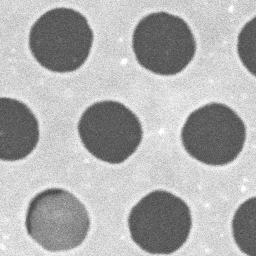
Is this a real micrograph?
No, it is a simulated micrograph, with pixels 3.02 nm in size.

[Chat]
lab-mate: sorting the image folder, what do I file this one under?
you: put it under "holes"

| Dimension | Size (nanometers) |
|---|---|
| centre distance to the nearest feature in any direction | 311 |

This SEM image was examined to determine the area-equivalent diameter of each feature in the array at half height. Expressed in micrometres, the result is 0.192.